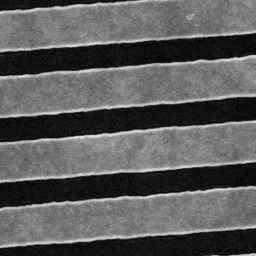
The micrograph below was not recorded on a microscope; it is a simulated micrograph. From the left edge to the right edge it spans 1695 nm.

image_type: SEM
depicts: lines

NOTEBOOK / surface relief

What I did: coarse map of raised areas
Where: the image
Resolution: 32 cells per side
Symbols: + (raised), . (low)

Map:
...........+++++++++++++++++++++
++++++++++++++++++++++++++++++++
++++++++++++++++++++++++++++++++
++++++++++++++++++++++++++++++++
++++++++++++++++++++++++++++....
++++++++++++++..................
................................
.........................+++++++
.............+++++++++++++++++++
.+++++++++++++++++++++++++++++++
++++++++++++++++++++++++++++++++
++++++++++++++++++++++++++++++++
+++++++++++++++++++++++++++.....
+++++++++++++++.................
+++.............................
..........................++++++
...............+++++++++++++++++
....++++++++++++++++++++++++++++
++++++++++++++++++++++++++++++++
++++++++++++++++++++++++++++++++
++++++++++++++++++++++++++++++..
+++++++++++++++++++.............
+++.............................
............................++++
..................++++++++++++++
.....+++++++++++++++++++++++++++
++++++++++++++++++++++++++++++++
++++++++++++++++++++++++++++++++
++++++++++++++++++++++++++++++++
++++++++++++++++++++............
+++++...........................
................................